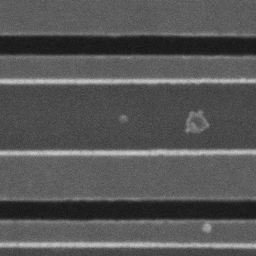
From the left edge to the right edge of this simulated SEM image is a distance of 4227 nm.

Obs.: lines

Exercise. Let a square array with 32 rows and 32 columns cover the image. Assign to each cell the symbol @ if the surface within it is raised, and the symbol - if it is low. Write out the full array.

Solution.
@@@@@@@@@@@@@@@@@@@@@@@@@@@@@@@@
@@@@@@@@@@@@@@@@@@@@@@@@@@@@@@@@
@@@@@@@@@@@@@@@@@@@@@@@@@@@@@@@@
@@@@@@@@@@@@@@@@@@@@@@@@@@@@@@@@
--------------------------------
--------------------------------
--------------------------------
@@@@@@@@@@@@@@@@@@@@@@@@@@@@@@@@
@@@@@@@@@@@@@@@@@@@@@@@@@@@@@@@@
@@@@@@@@@@@@@@@@@@@@@@@@@@@@@@@@
--------------------------------
--------------------------------
--------------------------------
--------------------------------
--------------------------------
--------------------------------
--------------------------------
--------------------------------
--------------------------------
@@@@@@@@@@@@@@@@@@@@@@@@@@@@@@@@
@@@@@@@@@@@@@@@@@@@@@@@@@@@@@@@@
@@@@@@@@@@@@@@@@@@@@@@@@@@@@@@@@
@@@@@@@@@@@@@@@@@@@@@@@@@@@@@@@@
@@@@@@@@@@@@@@@@@@@@@@@@@@@@@@@@
@@@@@@@@@@@@@@@@@@@@@@@@@@@@@@@@
--------------------------------
--------------------------------
--------------------------------
@@@@@@@@@@@@@@@@@@@@@@@@@@@@@@@@
@@@@@@@@@@@@@@@@@@@@@@@@@@@@@@@@
@@@@@@@@@@@@@@@@@@@@@@@@@@@@@@@@
--------------------------------